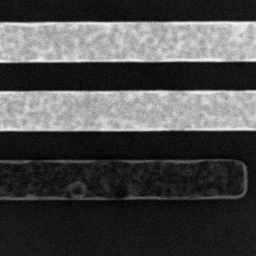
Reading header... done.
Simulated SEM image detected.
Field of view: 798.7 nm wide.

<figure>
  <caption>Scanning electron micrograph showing groups of lines, slits or small figures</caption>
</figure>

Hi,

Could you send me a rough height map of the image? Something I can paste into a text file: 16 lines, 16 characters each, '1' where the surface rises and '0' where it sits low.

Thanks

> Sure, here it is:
0000000000000000
1001111111111111
1111111111111111
1111111111111111
0000000000000000
0000000000000000
1111111111111111
1111111111111111
0000000000000000
0000000000000000
1111111111111110
1111111111111110
0000000000000000
0000000000000000
0000000000000000
0000000000000000